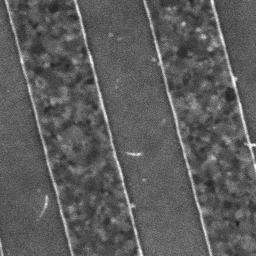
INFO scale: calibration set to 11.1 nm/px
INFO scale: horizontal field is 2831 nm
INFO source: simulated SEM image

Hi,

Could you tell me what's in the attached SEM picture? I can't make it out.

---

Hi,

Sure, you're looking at one or a few lines or trenches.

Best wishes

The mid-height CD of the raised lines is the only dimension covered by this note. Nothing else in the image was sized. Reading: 0.745 micrometres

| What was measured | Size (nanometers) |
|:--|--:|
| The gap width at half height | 736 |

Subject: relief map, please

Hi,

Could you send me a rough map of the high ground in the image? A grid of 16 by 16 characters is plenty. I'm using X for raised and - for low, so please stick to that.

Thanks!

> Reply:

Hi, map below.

XXXXX----XXXX---
-XXXX----XXXXX--
-XXXX-----XXXX--
-XXXXX----XXXX--
--XXXX----XXXX--
--XXXX----XXXXX-
--XXXX-----XXXX-
--XXXXX----XXXX-
---XXXX----XXXX-
---XXXX----XXXXX
---XXXX-----XXXX
---XXXXX----XXXX
----XXXX----XXXX
----XXXX-----XXX
----XXXX-----XXX
----XXXXX----XXX